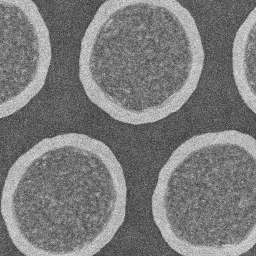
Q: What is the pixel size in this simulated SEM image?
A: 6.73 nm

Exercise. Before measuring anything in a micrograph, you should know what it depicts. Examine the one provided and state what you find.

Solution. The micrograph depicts raised bodies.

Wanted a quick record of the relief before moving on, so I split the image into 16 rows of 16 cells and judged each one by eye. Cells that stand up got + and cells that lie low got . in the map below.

++.....++++.....
++....++++++....
+++...++++++...+
+++..+++++++...+
+++..+++++++...+
++....++++++...+
+......++++.....
................
................
..++++.....+++++
.++++++....+++++
.++++++...++++++
++++++++..++++++
.++++++...++++++
.++++++...++++++
..++++.....++++.